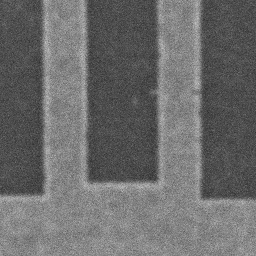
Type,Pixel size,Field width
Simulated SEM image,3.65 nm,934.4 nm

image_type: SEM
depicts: one or a few lines or trenches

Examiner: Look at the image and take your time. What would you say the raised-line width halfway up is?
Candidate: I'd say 140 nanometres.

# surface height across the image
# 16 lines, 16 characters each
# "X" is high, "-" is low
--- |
---XX-----XX----
---XX-----XX----
---XX-----XX----
---XX-----XX----
---XX-----XX----
---XX-----XX----
---XX-----XX----
---XX-----XX----
---XX-----XX----
---XX-----XX----
---XX-----XX----
---XXX----XX----
XXXXXXXXXXXXX---
XXXXXXXXXXXXXXXX
XXXXXXXXXXXXXXXX
XXXXXXXXXXXXXXXX